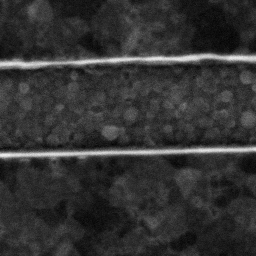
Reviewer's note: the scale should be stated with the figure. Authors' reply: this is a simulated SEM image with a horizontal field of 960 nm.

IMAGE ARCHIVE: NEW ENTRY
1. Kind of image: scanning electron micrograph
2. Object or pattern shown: one or a few lines or trenches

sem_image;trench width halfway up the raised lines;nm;345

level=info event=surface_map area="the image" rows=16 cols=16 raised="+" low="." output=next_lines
++++++++++++++++
++++++++++++++++
++++++++++++++++
++++++++++++++++
................
................
................
................
................
..........++++++
++++++++++++++++
++++++++++++++++
++++++++++++++++
++++++++++++++++
++++++++++++++++
++++++++++++++++